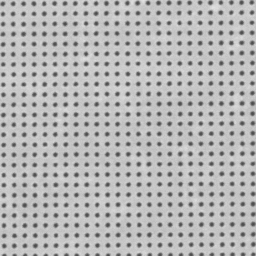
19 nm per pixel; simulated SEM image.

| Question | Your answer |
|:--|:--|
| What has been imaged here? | a regular array of holes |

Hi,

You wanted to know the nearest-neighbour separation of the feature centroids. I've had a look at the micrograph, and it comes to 9.95 px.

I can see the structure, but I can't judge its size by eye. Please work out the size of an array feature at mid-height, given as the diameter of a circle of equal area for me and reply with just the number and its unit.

93.3 nanometers